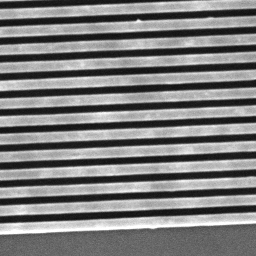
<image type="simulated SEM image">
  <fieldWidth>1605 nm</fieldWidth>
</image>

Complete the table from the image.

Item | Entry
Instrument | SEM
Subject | parallel lines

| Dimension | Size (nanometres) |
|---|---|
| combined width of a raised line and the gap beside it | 112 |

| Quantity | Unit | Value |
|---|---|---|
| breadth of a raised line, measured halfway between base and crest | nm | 64.2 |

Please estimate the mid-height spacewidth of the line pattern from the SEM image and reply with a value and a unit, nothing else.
47 nm